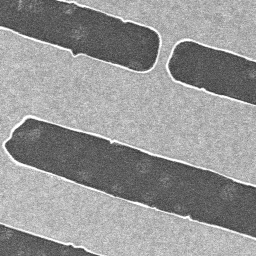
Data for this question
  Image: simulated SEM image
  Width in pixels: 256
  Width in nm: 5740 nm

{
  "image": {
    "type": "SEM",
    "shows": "one or a few lines or trenches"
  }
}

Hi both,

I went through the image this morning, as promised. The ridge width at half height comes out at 1650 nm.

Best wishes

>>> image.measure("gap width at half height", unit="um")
1.11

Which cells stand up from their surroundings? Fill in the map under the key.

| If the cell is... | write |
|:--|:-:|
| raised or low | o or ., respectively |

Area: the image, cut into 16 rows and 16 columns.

......oooooooooo
.........ooooooo
oo........oooooo
ooooo.....o....o
ooooooooooo.....
oooooooooooo....
oooooooooooooooo
oo.ooooooooooooo
o.....oooooooooo
.........ooooooo
oo...........ooo
ooooo...........
oooooooo........
ooooooooooo.....
..ooooooooooooo.
.....ooooooooooo